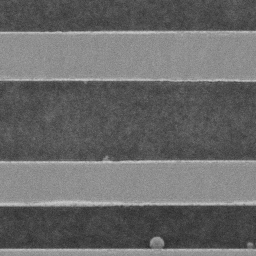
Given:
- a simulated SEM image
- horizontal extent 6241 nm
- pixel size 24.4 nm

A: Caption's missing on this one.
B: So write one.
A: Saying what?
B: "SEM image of lines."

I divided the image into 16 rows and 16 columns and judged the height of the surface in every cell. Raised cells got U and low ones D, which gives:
DDDDDDDDDDDDDDDD
DDDDDDDDDDDDDDDD
UUUUUUUUUUUUUUUU
UUUUUUUUUUUUUUUU
UUUUUUUUUUUUUUUU
DDDDDDDDDDDDDDDD
DDDDDDDDDDDDDDDD
DDDDDDDDDDDDDDDD
DDDDDDDDDDDDDDDD
DDDDDDDDDDDDDDDD
UUUUUUUUUUUUUUUU
UUUUUUUUUUUUUUUU
UUUUUUUUUUUUUUUU
DDDDDDDDDDDDDDDD
DDDDDDDDDDDDDDDD
DDDDDDDDDDDDDDDD